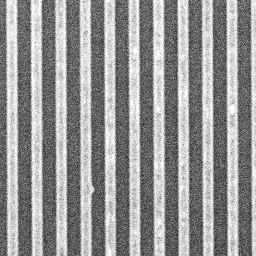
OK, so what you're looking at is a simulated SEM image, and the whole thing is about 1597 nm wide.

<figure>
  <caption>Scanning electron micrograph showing parallel lines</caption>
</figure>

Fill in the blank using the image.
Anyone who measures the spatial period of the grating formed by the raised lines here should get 153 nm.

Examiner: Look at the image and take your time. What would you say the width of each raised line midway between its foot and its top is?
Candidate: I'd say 0.0577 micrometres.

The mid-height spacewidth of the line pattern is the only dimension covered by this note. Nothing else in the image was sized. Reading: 14.9 pixels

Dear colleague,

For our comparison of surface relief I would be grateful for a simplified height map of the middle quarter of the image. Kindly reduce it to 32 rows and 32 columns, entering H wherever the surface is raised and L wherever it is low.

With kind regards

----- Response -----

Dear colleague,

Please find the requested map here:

LLLLHHHLLLHHHLLLHHHLLLLHHLLLLHHL
LLLLHHHLLLHHHLLLHHHLLLLHHLLLLHHL
LLLLHHHLLLHHHLLLHHHLLLLHHLLLLHHL
LLLLHHHLLLHHHLLLLHHLLLLHHLLLLHHL
LLLLHHHLLLHHHLLLLHHLLLLHHLLLLHHL
LLLLHHHLLLHHHLLLLHHLLLLHHLLLLHHL
LLLLHHHLLLHHHLLLLHHLLLLHHLLLLHHL
LLLLHHHLLLHHHLLLLHHLLLLHHLLLLHHL
LLLLHHHLLLHHHLLLLHHLLLLHHLLLLHHL
LLLLHHHLLLHHHLLLLHHLLLLHHLLLLHHL
LLLLHHHLLLHHHLLLLHHLLLLHHLLLLHHL
LLLLHHHLLLLHHLLLLHHLLLLHHLLLLHHL
LLLLHHHLLLLHHLLLLHHLLLLHHLLLLHHL
LLLLHHHLLLLHHLLLLHHLLLLHHLLLLHHL
LLLLHHHLLLLHHLLLLHHLLLLHHLLLLHHL
LLLLHHHLLLLHHLLLLHHLLLLHHLLLLHHL
LLLLHHHLLLLHHLLLLHHLLLLHHLLLLHHL
LLLLHHHLLLLHHLLLLHHLLLLHHLLLLHHL
LLLLHHHLLLLHHLLLLHHLLLLHHLLLLHHL
LLLLHHHLLLLHHLLLLHHLLLLHHLLLLHHL
LLLLHHHLLLLHHLLLLHHLLLLHHLLLLHHL
LLLLHHHLLLLHHLLLLHHLLLLHHLLLLHHL
LLLLHHHLLLLHHLLLLHHLLLLHHLLLLHHL
LLLLHHHLLLLHHLLLLHHLLLLHHLLLLHHL
LLLLHHHLLLLHHLLLLHHLLLLHHLLLLHHL
LLLLHHHLLLLHHLLLLHHLLLLHHLLLLHHL
LLLLHHHLLLLHHLLLLHHLLLLHHLLLLHHL
LLLLHHHLLLLHHLLLLHHLLLLHHLLLLHHL
LLLLHHHLLLLHHLLLLHHLLLLHHLLLLHHL
LLLLHHHLLLLHHLLLLHHLLLLHHLLLLHHL
LLLLHHHLLLLHHLLLLHHLLLLHHLLLLHHL
LLLLHHHLLLLHHLLLLHHLLLLHHLLLLHHL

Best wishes